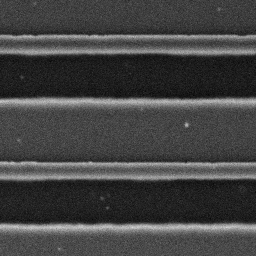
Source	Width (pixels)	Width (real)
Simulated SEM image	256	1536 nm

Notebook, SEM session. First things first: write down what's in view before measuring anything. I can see lines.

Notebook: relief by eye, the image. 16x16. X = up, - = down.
XXXXXXXXXXXXXXXX
XXXXXXXXXXXXXXXX
XXXXXXXXXXXXXXXX
----------------
----------------
----------------
XXXXXXXXXXXXXXXX
XXXXXXXXXXXXXXXX
XXXXXXXXXXXXXXXX
XXXXXXXXXXXXXXXX
XXXXXXXXXXXXXXXX
----------------
----------------
----------------
XXXXXXXXXXXXXXXX
XXXXXXXXXXXXXXXX